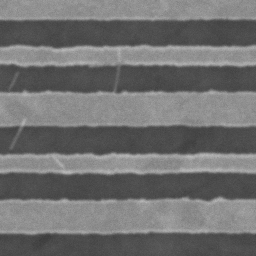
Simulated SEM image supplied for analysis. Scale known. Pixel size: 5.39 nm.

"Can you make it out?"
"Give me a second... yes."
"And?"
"lines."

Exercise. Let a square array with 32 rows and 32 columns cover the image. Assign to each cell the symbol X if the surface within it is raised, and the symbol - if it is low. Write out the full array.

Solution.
XXXXXXXXXXXXXXXXXXXXXXXXXXXXXXXX
XXXXXXXXXXXXXXXXXXXXXXXXXXXXXXXX
--X----------X--------X---------
--------------------------------
--------------------------------
--------------------------------
XXXXXXXXXXXXXXXXXXXXXXXXXXXXXXXX
XXXXXXXXXXXXXXXXXXXXXXXXXXXXXXXX
--------------------------------
--------------------------------
--------------------------------
--------------------------------
XXXXXXXXXXXXXXXXXXXXXXXXXXXXXXXX
XXXXXXXXXXXXXXXXXXXXXXXXXXXXXXXX
XXXXXXXXXXXXXXXXXXXXXXXXXXXXXXXX
XXXXXXXXXXXXXXXXXXXXXXXXXXXXXXXX
--------------------------------
--------------------------------
--------------------------------
-XXXXXXX-XXX-XXXXXXXXXXXXXXXXXXX
XXXXXXXXXXXXXXXXXXXXXXXXXXXXXXXX
-------XXXXXXXX--XXXX----------X
--------------------------------
--------------------------------
--------------------------------
XXXXXXXXXXXXXXXXXXXXXXXXXXXXXXXX
XXXXXXXXXXXXXXXXXXXXXXXXXXXXXXXX
XXXXXXXXXXXXXXXXXXXXXXXXXXXXXXXX
XXXXXXXXXXXXXXXXXXXXXXXXXXXXXXXX
--------------------------------
--------------------------------
--------------------------------